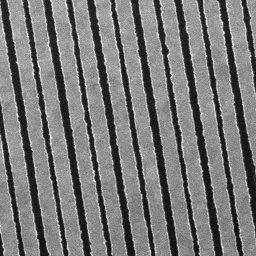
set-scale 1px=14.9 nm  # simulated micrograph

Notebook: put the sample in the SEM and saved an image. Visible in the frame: parallel lines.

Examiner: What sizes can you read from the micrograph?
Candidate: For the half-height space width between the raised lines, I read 110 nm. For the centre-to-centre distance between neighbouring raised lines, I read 321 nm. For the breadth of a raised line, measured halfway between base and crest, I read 215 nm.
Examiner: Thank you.